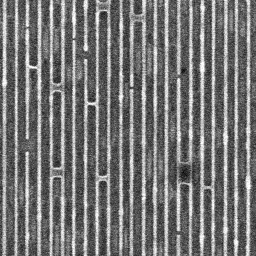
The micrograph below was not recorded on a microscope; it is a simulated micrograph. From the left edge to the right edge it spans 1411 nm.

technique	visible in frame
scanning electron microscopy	parallel lines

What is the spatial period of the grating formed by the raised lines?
63.9 nanometres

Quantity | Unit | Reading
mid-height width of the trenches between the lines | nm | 51.6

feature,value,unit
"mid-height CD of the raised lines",0.0151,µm